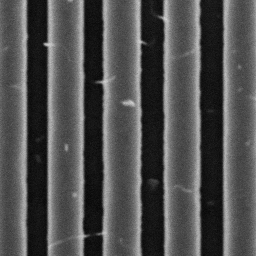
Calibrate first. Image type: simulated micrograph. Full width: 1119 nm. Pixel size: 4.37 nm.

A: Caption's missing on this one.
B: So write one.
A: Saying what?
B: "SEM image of lines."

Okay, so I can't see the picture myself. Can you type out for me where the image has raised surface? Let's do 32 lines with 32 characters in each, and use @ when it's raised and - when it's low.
@@@---@@@@---@@@@@---@@@@---@@@@
@@@---@@@@---@@@@@--@@@@@---@@@@
@@@---@@@@---@@@@@--@@@@@---@@@@
@@@---@@@@---@@@@@---@@@@---@@@@
@@@---@@@@---@@@@@---@@@@---@@@@
@@@---@@@@---@@@@@---@@@@---@@@@
@@@---@@@@---@@@@@---@@@@---@@@@
@@@---@@@@---@@@@@--@@@@@---@@@@
@@@---@@@@---@@@@@---@@@@---@@@@
@@@---@@@@---@@@@@---@@@@---@@@@
@@@---@@@@---@@@@----@@@@---@@@@
@@@---@@@@---@@@@@--@@@@@---@@@@
@@@---@@@@---@@@@@--@@@@@---@@@@
@@@---@@@@---@@@@@---@@@@---@@@@
@@@---@@@@---@@@@@---@@@@---@@@@
@@@---@@@@---@@@@@---@@@@---@@@@
@@@---@@@@---@@@@@--@@@@@---@@@@
@@@---@@@@---@@@@@--@@@@@---@@@@
@@@---@@@@---@@@@@---@@@@---@@@@
@@@---@@@@---@@@@@--@@@@@---@@@@
@@@---@@@@---@@@@@--@@@@@---@@@@
@@@---@@@@---@@@@@---@@@@---@@@@
@@@---@@@@---@@@@@--@@@@@---@@@@
@@@---@@@@---@@@@@---@@@@---@@@@
@@@---@@@@---@@@@@---@@@@---@@@@
@@@---@@@@---@@@@@---@@@@---@@@@
@@@---@@@@---@@@@@---@@@@---@@@@
@@@---@@@@---@@@@@---@@@@---@@@@
@@@---@@@@---@@@@@---@@@@---@@@@
@@@---@@@@@--@@@@@---@@@@---@@@@
@@@---@@@@---@@@@@---@@@@---@@@@
@@@---@@@@---@@@@@---@@@@---@@@@